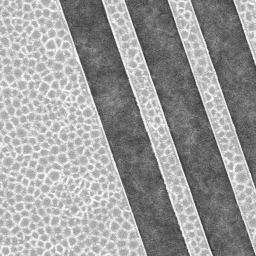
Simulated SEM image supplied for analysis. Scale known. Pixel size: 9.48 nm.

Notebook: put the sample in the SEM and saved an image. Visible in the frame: parallel lines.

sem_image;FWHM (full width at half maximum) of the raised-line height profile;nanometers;195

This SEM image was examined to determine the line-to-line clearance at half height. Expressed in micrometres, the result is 0.398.